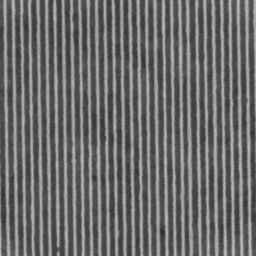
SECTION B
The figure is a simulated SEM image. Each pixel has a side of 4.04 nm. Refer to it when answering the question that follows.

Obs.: parallel lines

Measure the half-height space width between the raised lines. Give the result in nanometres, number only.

22.7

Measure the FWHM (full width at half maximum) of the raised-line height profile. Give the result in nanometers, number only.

10.1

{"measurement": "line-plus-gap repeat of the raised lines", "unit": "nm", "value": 33.7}